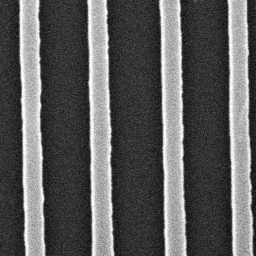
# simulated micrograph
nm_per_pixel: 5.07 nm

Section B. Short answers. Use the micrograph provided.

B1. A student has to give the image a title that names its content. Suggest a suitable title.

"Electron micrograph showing lines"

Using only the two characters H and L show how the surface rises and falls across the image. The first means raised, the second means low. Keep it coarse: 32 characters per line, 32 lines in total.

LLLHHLLLLLLHHLLLLLLLHHLLLLLLLHHL
LLLHHLLLLLLHHLLLLLLLHHLLLLLLLHHL
LLLHHLLLLLLHHLLLLLLLHHLLLLLLLHHL
LLLHHLLLLLLHHLLLLLLLHHLLLLLLLHHL
LLLHHLLLLLLHHLLLLLLLHHHLLLLLLHHL
LLLHHLLLLLLHHLLLLLLLHHHLLLLLLHHL
LLLHHLLLLLLHHLLLLLLLHHHLLLLLLHHL
LLLHHLLLLLLHHLLLLLLLHHHLLLLLLHHL
LLLHHLLLLLLHHLLLLLLLHHHLLLLLLHHL
LLLHHLLLLLLHHLLLLLLLHHHLLLLLLHHL
LLLHHLLLLLLHHLLLLLLLHHHLLLLLLHHL
LLLHHLLLLLLHHHLLLLLLHHHLLLLLLHHL
LLLHHLLLLLLHHHLLLLLLHHHLLLLLLHHL
LLLHHLLLLLLHHHLLLLLLHHHLLLLLLHHL
LLLHHLLLLLLHHHLLLLLLHHHLLLLLLHHL
LLLHHLLLLLLHHHLLLLLLHHHLLLLLLHHL
LLLHHLLLLLLHHHLLLLLLHHHLLLLLLHHL
LLLHHLLLLLLHHHLLLLLLLHHLLLLLLHHL
LLLHHLLLLLLHHHLLLLLLHHHLLLLLLHHL
LLLHHLLLLLLHHHLLLLLLHHHLLLLLLHHL
LLLHHLLLLLLHHHLLLLLLHHHLLLLLLHHL
LLLHHLLLLLLHHHLLLLLLLHHLLLLLLHHL
LLLHHLLLLLLHHHLLLLLLLHHLLLLLLHHL
LLLHHLLLLLLLHHLLLLLLLHHLLLLLLHHL
LLLHHLLLLLLLHHLLLLLLLHHLLLLLLHHL
LLLHHLLLLLLLHHLLLLLLLHHLLLLLLHHL
LLLHHLLLLLLLHHLLLLLLLHHLLLLLLHHL
LLLHHLLLLLLLHHLLLLLLLHHLLLLLLHHL
LLLHHLLLLLLLHHLLLLLLLHHLLLLLLHHL
LLLHHLLLLLLLHHLLLLLLLHHLLLLLLHHL
LLLHHHLLLLLLHHLLLLLLLHHLLLLLLHHL
LLLHHHLLLLLLHHLLLLLLLHHLLLLLLHHL